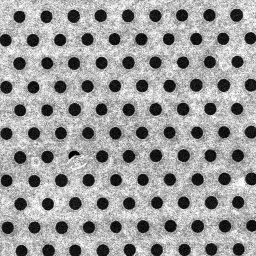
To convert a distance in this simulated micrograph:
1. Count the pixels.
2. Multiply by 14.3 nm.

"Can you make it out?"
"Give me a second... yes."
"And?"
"a regular array of holes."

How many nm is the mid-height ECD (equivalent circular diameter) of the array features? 178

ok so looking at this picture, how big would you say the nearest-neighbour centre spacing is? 383 nm